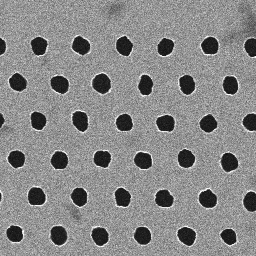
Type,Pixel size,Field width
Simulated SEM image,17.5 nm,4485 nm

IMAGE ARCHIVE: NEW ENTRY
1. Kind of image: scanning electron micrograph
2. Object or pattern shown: a regular array of holes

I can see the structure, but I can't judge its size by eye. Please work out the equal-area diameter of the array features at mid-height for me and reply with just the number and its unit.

307 nm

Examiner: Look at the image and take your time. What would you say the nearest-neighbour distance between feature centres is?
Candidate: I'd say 734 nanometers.